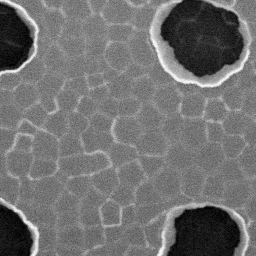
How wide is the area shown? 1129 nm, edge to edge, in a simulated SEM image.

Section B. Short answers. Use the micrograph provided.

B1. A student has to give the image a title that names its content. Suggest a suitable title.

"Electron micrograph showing holes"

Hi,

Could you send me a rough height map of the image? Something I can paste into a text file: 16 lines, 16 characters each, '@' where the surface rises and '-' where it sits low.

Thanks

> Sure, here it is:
-@@@@@@@@@@---@@
--@@@@@@@@-----@
--@@@@@@@@-----@
--@@@@@@@@@----@
@@@@@@@@@@@@--@@
@@@@@@@@@@@@@@@@
@@@@@@@@@@@@@@@@
@@@@@@@@@@@@@@@@
@@@@@@@@@@@@@@@@
@@@@@@@@@@@@@@@@
@@@@@@@@@@@@@@@@
@@@@@@@@@@@@@@@@
@@@@@@@@@@@@@@@@
-@@@@@@@@@@---@@
--@@@@@@@@@----@
--@@@@@@@@-----@